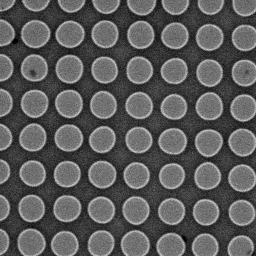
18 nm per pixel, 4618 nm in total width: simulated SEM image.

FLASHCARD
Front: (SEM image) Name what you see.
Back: an array of small figures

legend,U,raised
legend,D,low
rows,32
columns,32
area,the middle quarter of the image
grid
UUUUUDDUUUUUUDDDUUUUUUDDDUUUUUUD
UUUUUDDUUUUUUDDDUUUUUUDDUUUUUUUD
UUUUDDDUUUUUUDDDUUUUUUDDUUUUUUUD
UUUUDDDDUUUUUDDDUUUUUDDDDUUUUUDD
UUUDDDDDDUUDDDDDDUUUDDDDDDUUUDDD
DDDDDDDDDDDDDDDDDDDDDDDDDDDDDDDD
DDDDDDDDDDDDDDDDDDDDDDDDDDDDDDDD
UUUUDDDDUUUUDDDDDUUUDDDDDDDDDDDD
UUUUDDDUUUUUUDDDUUUUUDDDDUUUUUDD
UUUUDDDUUUUUUDDDUUUUUUDDDUUUUUDD
UUUUDDDUUUUUUDDDUUUUUUDDUUUUUUUD
UUUUDDDUUUUUUDDDUUUUUUDDUUUUUUUD
UUUDDDDUUUUUDDDDUUUUUDDDDUUUUUDD
DDDDDDDDDUDDDDDDDDUUDDDDDDUUUDDD
DDDDDDDDDDDDDDDDDDDDDDDDDDDDDDDD
UUUDDDDDDDDDDDDDDDDDDDDDDDDDDDDD
UUUUDDDDUUUUDDDDDUUUUDDDDDUUUDDD
UUUUDDDUUUUUUDDDUUUUUDDDUUUUUUDD
UUUUUDUUUUUUUDDDUUUUUUDDUUUUUUDD
UUUUDDUUUUUUUDDDUUUUUUDDUUUUUUUD
UUUUDDDUUUUUDDDDUUUUUUDDUUUUUUDD
UUDDDDDDUUUDDDDDDUUUUDDDDUUUUUDD
DDDDDDDDDDDDDDDDDDDDDDDDDDDDDDDD
DDDDDDDDDDDDDDDDDDDDDDDDDDDDDDDD
UUDDDDDDUUUDDDDDDDDDDDDDDDDDDDDD
UUUDDDDUUUUUDDDDUUUUDDDDDUUUUDDD
UUUUDDUUUUUUUDDUUUUUUDDDUUUUUUDD
UUUUDDUUUUUUUDDUUUUUUDDDUUUUUUDD
UUUUDDUUUUUUUDDUUUUUUDDDUUUUUUDD
UUUDDDDUUUUUDDDUUUUUUDDDUUUUUUDD
UUDDDDDDUUUDDDDDUUUUDDDDDUUUUDDD
DDDDDDDDDDDDDDDDDDDDDDDDDDDDDDDD